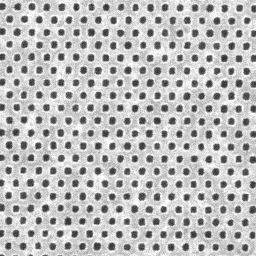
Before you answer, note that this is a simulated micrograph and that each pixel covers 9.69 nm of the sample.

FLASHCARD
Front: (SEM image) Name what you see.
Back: a regular array of holes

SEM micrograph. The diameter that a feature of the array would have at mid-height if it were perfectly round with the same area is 0.0825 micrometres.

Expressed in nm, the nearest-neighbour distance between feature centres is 138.